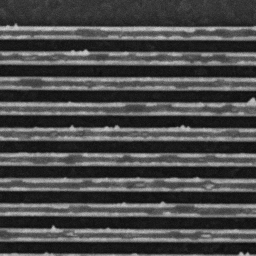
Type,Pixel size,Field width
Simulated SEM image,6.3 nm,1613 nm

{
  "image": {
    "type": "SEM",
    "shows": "parallel lines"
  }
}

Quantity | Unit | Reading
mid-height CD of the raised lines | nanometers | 74.8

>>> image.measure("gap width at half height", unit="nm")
86.6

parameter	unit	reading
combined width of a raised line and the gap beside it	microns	0.159